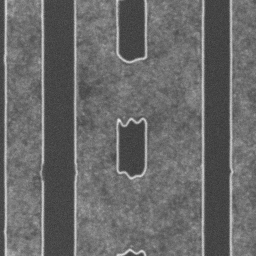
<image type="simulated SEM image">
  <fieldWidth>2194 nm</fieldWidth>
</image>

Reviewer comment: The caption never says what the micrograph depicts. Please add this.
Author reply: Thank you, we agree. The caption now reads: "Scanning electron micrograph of one or a few lines or trenches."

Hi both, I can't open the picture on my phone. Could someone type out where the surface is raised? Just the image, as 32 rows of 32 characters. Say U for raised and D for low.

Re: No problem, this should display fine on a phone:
UDDDDUUUUDDDDDDUUUDDDDDDDUUUUDDD
UDDDDUUUUDDDDDDUUUDDDDDDDUUUUDDD
UDDDDUUUUDDDDDDUUUDDDDDDDUUUUDDD
UDDDDUUUUDDDDDDUUUDDDDDDDUUUUDDD
UDDDDUUUUDDDDDDUUUDDDDDDDUUUUDDD
UDDDDUUUUDDDDDDUUUDDDDDDDUUUUDDD
UDDDDUUUUDDDDDDUUUDDDDDDDUUUUDDD
UDDDDUUUUDDDDDDUUDDDDDDDDUUUUDDD
UDDDDUUUUDDDDDDDDDDDDDDDDUUUUDDD
UDDDDUUUUDDDDDDDDDDDDDDDDUUUUDDD
UDDDDUUUUDDDDDDDDDDDDDDDDUUUUDDD
UDDDDUUUUDDDDDDDDDDDDDDDDUUUUDDD
UDDDDUUUUDDDDDDDDDDDDDDDDUUUUDDD
UDDDDUUUUDDDDDDDDDDDDDDDDUUUUDDD
UDDDDUUUUDDDDDDDDDDDDDDDDUUUUDDD
UDDDDUUUUDDDDDDDUUDDDDDDDUUUUDDD
UDDDDUUUUDDDDDDUUUDDDDDDDUUUUDDD
UDDDDUUUUDDDDDDUUUDDDDDDDUUUUDDD
UDDDDUUUUDDDDDDUUUDDDDDDDUUUUDDD
UDDDDUUUUDDDDDDUUUDDDDDDDUUUUDDD
UDDDDUUUUUDDDDDUUUDDDDDDDUUUUDDD
UDDDDUUUUUDDDDDUUUDDDDDDDUUUUDDD
UDDDDUUUUUDDDDDDDDDDDDDDDUUUUDDD
UDDDDUUUUDDDDDDDDDDDDDDDDUUUUDDD
UDDDDUUUUDDDDDDDDDDDDDDDDUUUUDDD
UDDDDUUUUDDDDDDDDDDDDDDDDUUUUDDD
UDDDDUUUUDDDDDDDDDDDDDDDDUUUUDDD
UDDDDUUUUDDDDDDDDDDDDDDDDUUUUDDD
UDDDDUUUUDDDDDDDDDDDDDDDDUUUUDDD
UDDDDUUUUDDDDDDDDDDDDDDDDUUUUDDD
UDDDDUUUUDDDDDDDDDDDDDDDDUUUUDDD
UDDDDUUUUDDDDDDDUUDDDDDDDUUUUDDD